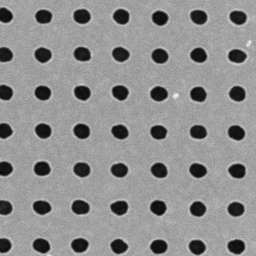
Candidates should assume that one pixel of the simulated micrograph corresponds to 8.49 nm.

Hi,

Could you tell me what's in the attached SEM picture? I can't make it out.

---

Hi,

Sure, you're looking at a regular array of holes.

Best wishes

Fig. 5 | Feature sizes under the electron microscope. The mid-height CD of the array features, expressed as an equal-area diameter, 139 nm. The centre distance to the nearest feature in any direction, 0.322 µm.